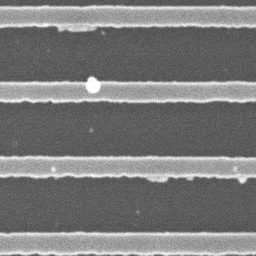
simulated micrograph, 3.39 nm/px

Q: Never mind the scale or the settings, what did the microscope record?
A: lines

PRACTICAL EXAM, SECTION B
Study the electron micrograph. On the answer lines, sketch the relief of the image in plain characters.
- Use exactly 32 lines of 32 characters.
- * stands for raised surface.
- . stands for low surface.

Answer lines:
................................
********************************
********************************
.........**.....................
................................
................................
................................
................................
................................
................................
********************************
********************************
********************************
................................
................................
................................
................................
................................
................................
................................
********************************
********************************
................................
................................
................................
................................
................................
................................
................................
********************************
********************************
********************************